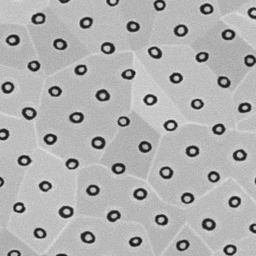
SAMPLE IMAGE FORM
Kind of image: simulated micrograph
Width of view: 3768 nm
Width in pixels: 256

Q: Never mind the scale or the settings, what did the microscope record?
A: a regular array of ring-shaped grooves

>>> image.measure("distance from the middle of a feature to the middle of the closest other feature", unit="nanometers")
485